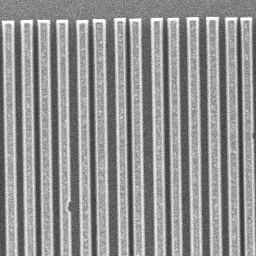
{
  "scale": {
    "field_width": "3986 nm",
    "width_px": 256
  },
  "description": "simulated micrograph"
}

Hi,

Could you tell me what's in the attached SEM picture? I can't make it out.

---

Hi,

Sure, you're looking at parallel lines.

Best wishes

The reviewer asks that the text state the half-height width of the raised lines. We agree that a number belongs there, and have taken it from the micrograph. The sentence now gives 158 nm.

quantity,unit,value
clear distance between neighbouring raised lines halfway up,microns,0.132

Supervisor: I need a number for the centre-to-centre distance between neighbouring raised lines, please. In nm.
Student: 285